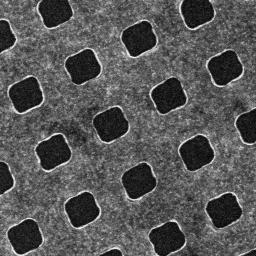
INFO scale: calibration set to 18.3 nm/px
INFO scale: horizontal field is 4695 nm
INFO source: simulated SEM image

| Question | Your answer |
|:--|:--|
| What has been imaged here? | a regular array of raised bodies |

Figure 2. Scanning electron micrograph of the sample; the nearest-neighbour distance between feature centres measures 1.16 micrometres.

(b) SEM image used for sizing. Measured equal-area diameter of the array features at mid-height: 35 px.